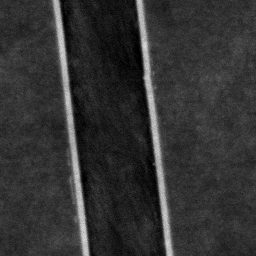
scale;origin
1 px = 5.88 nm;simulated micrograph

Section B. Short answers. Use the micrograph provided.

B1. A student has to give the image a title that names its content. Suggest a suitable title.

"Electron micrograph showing one or a few lines or trenches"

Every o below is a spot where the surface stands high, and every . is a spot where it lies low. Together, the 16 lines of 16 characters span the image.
oooo.....ooooooo
oooo.....ooooooo
oooo.....ooooooo
oooo.....ooooooo
oooo.....ooooooo
oooo.....ooooooo
oooo.....ooooooo
oooo......oooooo
ooooo.....oooooo
ooooo.....oooooo
ooooo.....oooooo
ooooo.....oooooo
ooooo.....oooooo
ooooo.....oooooo
ooooo.....oooooo
ooooo......ooooo